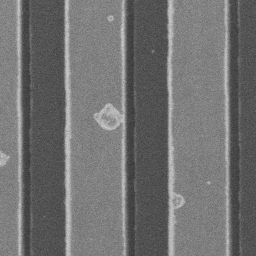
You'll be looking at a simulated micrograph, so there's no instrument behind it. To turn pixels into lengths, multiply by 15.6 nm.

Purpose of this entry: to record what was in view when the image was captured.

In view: lines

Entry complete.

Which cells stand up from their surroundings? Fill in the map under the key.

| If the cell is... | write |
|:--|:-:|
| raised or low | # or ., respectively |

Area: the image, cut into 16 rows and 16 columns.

#...####..####..
#...####...###..
#...####...###..
#...####..####..
#...####..####..
#...####..####..
#...####...###..
#...####...###..
#...####...###..
#...####...###..
#...####...###..
#...####...###..
#...####...###..
#...####...###..
#...####...###..
#...####...###..